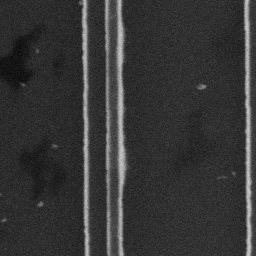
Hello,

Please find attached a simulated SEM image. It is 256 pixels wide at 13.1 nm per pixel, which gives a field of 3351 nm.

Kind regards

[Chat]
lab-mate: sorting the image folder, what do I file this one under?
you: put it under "lines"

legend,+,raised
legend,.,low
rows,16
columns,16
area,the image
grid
.....++........+
.....++........+
.....++........+
.....++........+
.....++........+
.....++........+
.....++........+
.....++.........
.....++.........
.....++.........
.....++.........
.....++.........
.....++.........
.....++.........
.....++.........
.....++.........